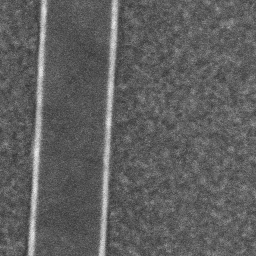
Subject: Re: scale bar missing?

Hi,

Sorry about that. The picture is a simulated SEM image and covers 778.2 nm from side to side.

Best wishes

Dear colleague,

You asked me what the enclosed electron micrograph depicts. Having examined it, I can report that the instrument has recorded one or a few lines or trenches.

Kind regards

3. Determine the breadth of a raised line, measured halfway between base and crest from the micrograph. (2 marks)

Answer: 223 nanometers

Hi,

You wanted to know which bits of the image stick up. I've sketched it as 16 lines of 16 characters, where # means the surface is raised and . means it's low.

...####.........
...####.........
...####.........
..#####.........
..#####.........
..#####.........
..#####.........
..#####.........
..#####.........
..#####.........
..#####.........
..#####.........
..#####.........
..#####.........
..#####.........
..####..........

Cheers